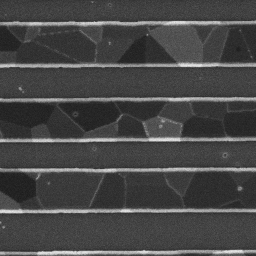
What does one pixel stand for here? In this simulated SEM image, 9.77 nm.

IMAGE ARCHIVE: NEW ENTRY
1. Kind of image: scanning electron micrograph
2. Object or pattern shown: lines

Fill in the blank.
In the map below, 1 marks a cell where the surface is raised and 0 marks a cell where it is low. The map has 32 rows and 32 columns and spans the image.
00000000000000000000000000000000
00000000000000000000000000000000
00000000000000000000000000000000
11111111111111111111111111111111
11111111111111111111111111111111
11111111111111111111111111111111
11111111111111111111111111111111
11111111111111111111111111111111
00000000000000000000000000000000
00000000000000000000000000000000
00000000000000000000000000000000
00000000000000000000000000000000
00001111111111111111111111111111
11111111111111111111111111111111
11111111111111111111111111111111
11111111111111111111111111111111
11111111111111111111111111111111
00100000000000000000000000000000
00000000000000000000000000000000
00000000000000000000000000000000
00000000000000000000000000000000
11111111111111111111111111111111
11111111111111111111111111111111
11111111111111111111111111111111
11111111111111111111111111111111
11111111111111111111111111111111
00000000000000000000000000000000
00000000000000000000000000000000
00000000000000000000000000000000
00000000000000000000000000000000
00000000000000000000000000000000
00000000000000000000000111000111